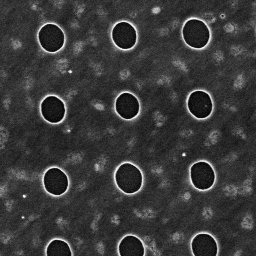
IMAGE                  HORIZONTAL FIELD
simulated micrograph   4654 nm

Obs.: a regular array of holes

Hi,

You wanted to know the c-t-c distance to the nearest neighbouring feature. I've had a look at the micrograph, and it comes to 1.29 micrometres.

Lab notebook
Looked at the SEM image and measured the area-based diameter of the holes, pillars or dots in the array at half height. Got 480 nanometres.